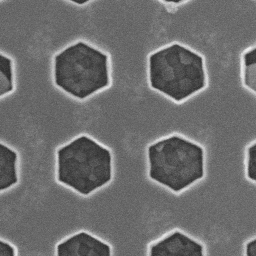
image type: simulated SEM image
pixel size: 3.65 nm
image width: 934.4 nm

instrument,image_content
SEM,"holes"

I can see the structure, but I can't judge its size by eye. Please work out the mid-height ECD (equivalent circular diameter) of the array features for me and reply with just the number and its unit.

198 nm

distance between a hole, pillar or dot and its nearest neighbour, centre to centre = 91.3 px